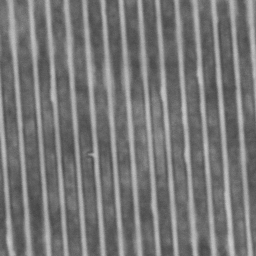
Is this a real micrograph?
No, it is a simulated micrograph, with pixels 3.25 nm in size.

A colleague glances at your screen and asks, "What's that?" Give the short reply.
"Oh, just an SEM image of parallel lines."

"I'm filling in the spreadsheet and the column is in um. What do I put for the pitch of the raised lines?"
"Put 0.0597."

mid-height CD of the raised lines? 12.2 nanometers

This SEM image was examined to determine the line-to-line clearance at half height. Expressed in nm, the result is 47.4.